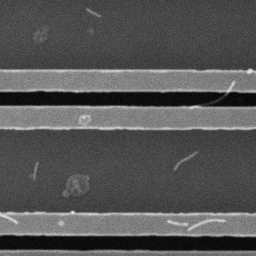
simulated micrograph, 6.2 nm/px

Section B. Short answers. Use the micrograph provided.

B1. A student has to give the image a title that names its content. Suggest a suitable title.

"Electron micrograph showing lines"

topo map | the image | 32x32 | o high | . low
................................
................................
................................
................................
................................
................................
................................
................................
................................
oooooooooooooooooooooooooooooooo
oooooooooooooooooooooooooooooooo
.........ooooo......o......ooooo
................................
oooooooooooooooooooooooooooooooo
oooooooooooooooooooooooooooooooo
oooooooooooooooooooooooooooooooo
................................
................................
................................
................................
................................
................................
................................
................................
................................
................................
................................
oooooooooooooooooooooooooooooooo
oooooooooooooooooooooooooooooooo
.......................oo.oo.ooo
................................
oooooooooooooooooooooooooooooooo